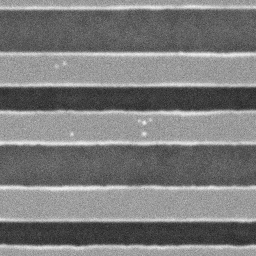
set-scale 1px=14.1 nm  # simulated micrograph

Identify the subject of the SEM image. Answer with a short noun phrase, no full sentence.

lines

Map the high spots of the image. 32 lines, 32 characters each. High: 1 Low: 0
11111111111111111111111111111111
00000000000000000000000000000000
00000000000000000000000000000000
00000000000000000000000000000000
00000000000000000000000000000000
00000000000000000000000000000000
00000000000000000000000000000000
11111111111111111111111111111111
11111111111111111111111111111111
11111111111111111111111111111111
11111111111111111111111111111111
00000000000000000000000000000000
00000000000000000000000000000000
00000000000000000000000000000000
11111111111111111111111111111111
11111111111111111111111111111111
11111111111111111111111111111111
11111111111111111111111111111111
00000000000000000000000000000000
00000000000000000000000000000000
00000000000000000000000000000000
00000000000000000000000000000000
00000000000000000000000000000000
11111111111111111111111111111111
11111111111111111111111111111111
11111111111111111111111111111111
11111111111111111111111111111111
11111111111111111111111111111111
00000000000000000000000000000000
00000000000000000000000000000000
00000000000000000000000000000000
11111111111111111111111111111111